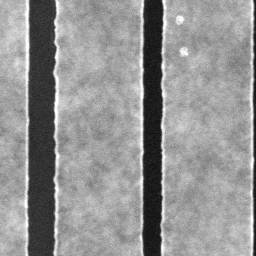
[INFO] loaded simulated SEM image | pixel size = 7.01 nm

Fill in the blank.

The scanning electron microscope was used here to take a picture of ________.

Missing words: lines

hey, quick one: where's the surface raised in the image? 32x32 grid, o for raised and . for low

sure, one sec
oooo...ooooooooooo..oooooooooooo
oooo...ooooooooooo..oooooooooooo
oooo...ooooooooooo..oooooooooooo
oooo...ooooooooooo..oooooooooooo
oooo...ooooooooooo..oooooooooooo
oooo...ooooooooooo..oooooooooooo
oooo...ooooooooooo..oooooooooooo
oooo...ooooooooooo..oooooooooooo
oooo...ooooooooooo..oooooooooooo
ooo....ooooooooooo..oooooooooooo
ooo....ooooooooooo..oooooooooooo
ooo....ooooooooooo..oooooooooooo
ooo....ooooooooooo..oooooooooooo
ooo....ooooooooooo..oooooooooooo
oooo...ooooooooooo..oooooooooooo
oooo...ooooooooooo..oooooooooooo
ooo....ooooooooooo..oooooooooooo
ooo....ooooooooooo..oooooooooooo
ooo....ooooooooooo..oooooooooooo
ooo....ooooooooooo..oooooooooooo
ooo....ooooooooooo..oooooooooooo
ooo....ooooooooooo..oooooooooooo
ooo....ooooooooooo..oooooooooooo
ooo....ooooooooooo..oooooooooooo
ooo....ooooooooooo..oooooooooooo
ooo....ooooooooooo..oooooooooooo
ooo....ooooooooooo..oooooooooooo
ooo....ooooooooooo..oooooooooooo
ooo....ooooooooooo..oooooooooooo
ooo....ooooooooooo..oooooooooooo
ooo....ooooooooooo..oooooooooooo
ooo....ooooooooooo..oooooooooooo